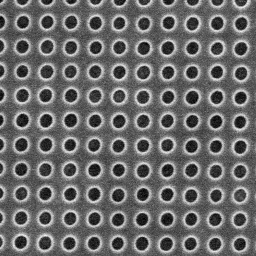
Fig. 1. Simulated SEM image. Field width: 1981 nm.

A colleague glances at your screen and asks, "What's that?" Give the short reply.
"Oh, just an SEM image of a regular array of holes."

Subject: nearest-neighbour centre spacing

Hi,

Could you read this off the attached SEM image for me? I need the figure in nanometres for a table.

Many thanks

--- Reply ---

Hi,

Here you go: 185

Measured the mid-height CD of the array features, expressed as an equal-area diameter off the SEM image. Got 102 nm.